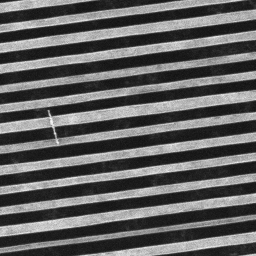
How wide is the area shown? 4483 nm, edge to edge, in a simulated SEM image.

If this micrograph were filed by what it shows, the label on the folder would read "parallel lines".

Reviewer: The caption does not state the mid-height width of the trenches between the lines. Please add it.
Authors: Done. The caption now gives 115 nanometers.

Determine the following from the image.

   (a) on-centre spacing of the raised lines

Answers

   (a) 351 nm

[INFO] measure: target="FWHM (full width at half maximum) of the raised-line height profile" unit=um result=0.228